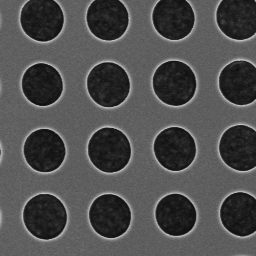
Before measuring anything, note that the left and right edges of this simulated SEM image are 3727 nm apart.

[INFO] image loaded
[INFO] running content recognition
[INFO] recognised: a regular array of holes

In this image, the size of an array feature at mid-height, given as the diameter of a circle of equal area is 626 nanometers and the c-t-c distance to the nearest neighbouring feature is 951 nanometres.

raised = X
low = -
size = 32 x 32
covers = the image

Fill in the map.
XXX----XXXX----XXXXX----XXX-----
XXX-----XXX-----XXX-----XXX-----
XXX-----XXX-----XXX-----XXX-----
XXX-----XXX-----XXX-----XXX-----
XXXX---XXXXX---XXXXX---XXXXX---X
XXXXXXXXXXXXXXXXXXXXXXXXXXXXXXXX
XXXXXXXXXXXXXXXXXXXXXXXXXXXXXXXX
XXXXXXXXXXXXXXXXXXXXXXXXXXXXXXXX
XXXX---XXXXX---XXXXX----XXXX----
XXX-----XXX-----XXX-----XXX-----
XXX-----XXX-----XXX------XX-----
XXX-----XXX-----XXX-----XXXX----
XXXX---XXXXX----XXXX----XXXX----
XXXXXXXXXXXXXXXXXXXXXXXXXXXXXXXX
XXXXXXXXXXXXXXXXXXXXXXXXXXXXXXXX
XXXXXXXXXXXXXXXXXXXXXXXXXXXXXXXX
XXXX---XXXXX---XXXXX---XXXXX----
XXX-----XXX-----XXX-----XXXX----
XXX-----XXX-----XXX-----XXX-----
XXX-----XXX-----XXX-----XXXX----
XXXX----XXXX----XXXX----XXXX----
XXXXX-XXXXXXX--XXXXXXXXXXXXXXXXX
XXXXXXXXXXXXXXXXXXXXXXXXXXXXXXXX
XXXXXXXXXXXXXXXXXXXXXXXXXXXXXXXX
XXXX---XXXXX---XXXXXX--XXXXXX--X
XXX-----XXXX----XXXX----XXXX----
XXX-----XXX-----XXX-----XXXX----
XXX-----XXX-----XXX-----XXXX----
XXX-----XXXX----XXXX----XXXX----
XXXX---XXXXXX--XXXXXXXXXXXXXXX-X
XXXXXXXXXXXXXXXXXXXXXXXXXXXXXXXX
XXXXXXXXXXXXXXXXXXXXXXXXXXXXXXXX